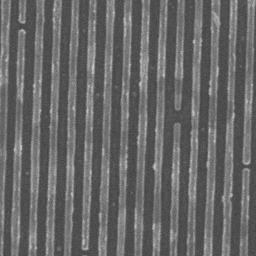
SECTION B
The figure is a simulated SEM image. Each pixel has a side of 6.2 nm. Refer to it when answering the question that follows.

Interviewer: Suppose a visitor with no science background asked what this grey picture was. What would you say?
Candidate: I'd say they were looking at parallel lines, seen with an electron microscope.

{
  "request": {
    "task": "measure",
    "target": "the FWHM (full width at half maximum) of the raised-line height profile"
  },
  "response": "44.9 nanometres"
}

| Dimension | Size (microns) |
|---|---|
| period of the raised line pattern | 0.109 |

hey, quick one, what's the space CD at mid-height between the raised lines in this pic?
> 67.4 nanometres